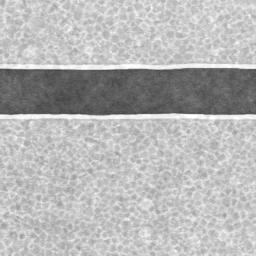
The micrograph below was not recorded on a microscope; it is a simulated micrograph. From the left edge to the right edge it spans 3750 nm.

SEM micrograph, one or a few lines or trenches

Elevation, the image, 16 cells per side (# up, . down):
################
################
################
################
................
................
................
################
################
################
################
################
################
################
################
################